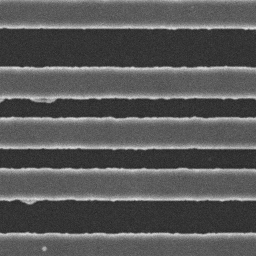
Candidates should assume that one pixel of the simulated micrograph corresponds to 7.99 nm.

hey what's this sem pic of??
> lines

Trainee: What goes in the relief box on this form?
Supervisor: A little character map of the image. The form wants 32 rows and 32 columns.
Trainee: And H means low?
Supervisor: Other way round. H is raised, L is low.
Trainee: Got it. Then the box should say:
HHHHHHHHHHHHHHHHHHHHHHHHHHHHHHHH
HHHHHHHHHHHHHHHHHHHHHHHHHHHHHHHH
HHHHHHHHHHHHHHHHHHHHHHHHHHHHHHHH
HHHHHHHHHHHHHHHHHHHHHHHHHHHHHHHH
LLLLLLLLLLLLLLLLLLLLLLLLLLLLLLLL
LLLLLLLLLLLLLLLLLLLLLLLLLLLLLLLL
LLLLLLLLLLLLLLLLLLLLLLLLLLLLLLLL
LLLLLLLLLLLLLLLLLLLLLLLLLLLLLLLL
HHHHHHHHHHHHHHHLHLLHHHHHHHHHHHHL
HHHHHHHHHHHHHHHHHHHHHHHHHHHHHHHH
HHHHHHHHHHHHHHHHHHHHHHHHHHHHHHHH
HHHHHHHHHHHHHHHHHHHHHHHHHHHHHHHH
LLLLHHHLLLLLLLLLLLLLLLLLLLLLLLLL
LLLLLLLLLLLLLLLLLLLLLLLLLLLLLLLL
LLLLLLLLLLLLLLLLLLLLLLLLLLLLLLLL
HHHHHHHHHHHHHHHHHHHHHHHHHHHHHHHH
HHHHHHHHHHHHHHHHHHHHHHHHHHHHHHHH
HHHHHHHHHHHHHHHHHHHHHHHHHHHHHHHH
HHHHHHHHHHHHHHHHHHHHHHHHHHHHHHHH
LLLLLLLLLLLLLLLLLLLLLLLLLLLLLLLL
LLLLLLLLLLLLLLLLLLLLLLLLLLLLLLLL
HHHHHHHHHHHHHHHHHHHHHHHHHHHHHHHH
HHHHHHHHHHHHHHHHHHHHHHHHHHHHHHHH
HHHHHHHHHHHHHHHHHHHHHHHHHHHHHHHH
HHHHHHHHHHHHHHHHHHHHHHHHHHHHHHHH
LLLLLLLLLLLLLLLLLLLLLLLLLLLLLLLL
LLLLLLLLLLLLLLLLLLLLLLLLLLLLLLLL
LLLLLLLLLLLLLLLLLLLLLLLLLLLLLLLL
LLLLLLLLLLLLLLLLLLLLLLLLLLLLLLLL
HHHHHHHHHHHHHHHHHHHHHHHHHHHHHHHH
HHHHHHHHHHHHHHHHHHHHHHHHHHHHHHHH
HHHHHHHHHHHHHHHHHHHHHHHHHHHHHHHH